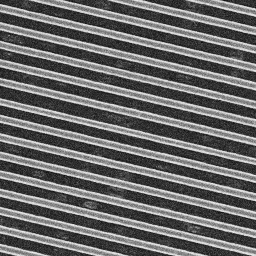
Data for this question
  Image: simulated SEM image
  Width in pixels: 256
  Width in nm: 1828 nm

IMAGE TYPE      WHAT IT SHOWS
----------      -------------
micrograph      parallel lines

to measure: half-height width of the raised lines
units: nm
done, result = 49.5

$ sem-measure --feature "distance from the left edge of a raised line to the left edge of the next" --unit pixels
18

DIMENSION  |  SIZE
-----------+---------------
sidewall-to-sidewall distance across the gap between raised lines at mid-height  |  80.8 nm